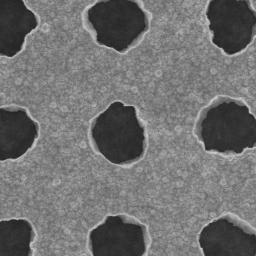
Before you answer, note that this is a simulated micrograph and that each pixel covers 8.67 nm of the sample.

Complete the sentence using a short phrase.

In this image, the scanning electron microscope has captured holes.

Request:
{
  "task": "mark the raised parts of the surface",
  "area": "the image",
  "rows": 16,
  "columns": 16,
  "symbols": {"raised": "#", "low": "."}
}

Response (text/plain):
..####...####...
..####...####...
..####..#####...
.###############
################
################
#######.#####..#
..####...###....
..####...###....
..####...#####.#
################
################
################
################
..####...####...
..####...####...